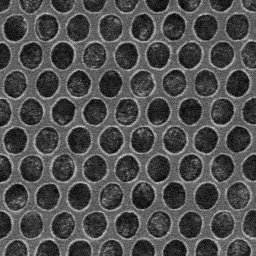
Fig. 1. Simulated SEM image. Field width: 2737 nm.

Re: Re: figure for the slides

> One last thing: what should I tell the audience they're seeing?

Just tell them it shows a regular array of holes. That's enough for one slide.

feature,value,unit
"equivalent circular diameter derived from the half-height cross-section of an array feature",25.7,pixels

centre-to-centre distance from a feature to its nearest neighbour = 337 nm